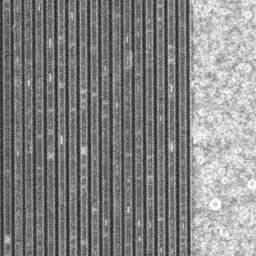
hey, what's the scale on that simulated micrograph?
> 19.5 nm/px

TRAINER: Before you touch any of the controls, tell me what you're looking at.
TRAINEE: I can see parallel lines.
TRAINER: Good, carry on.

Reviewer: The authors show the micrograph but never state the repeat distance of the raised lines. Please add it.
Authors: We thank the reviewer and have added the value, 214 nanometres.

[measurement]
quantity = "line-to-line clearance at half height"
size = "90 nm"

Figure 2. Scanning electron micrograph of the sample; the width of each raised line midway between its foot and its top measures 124 nm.